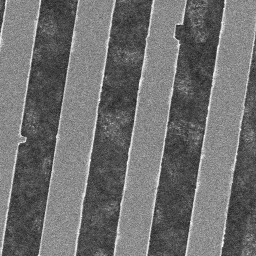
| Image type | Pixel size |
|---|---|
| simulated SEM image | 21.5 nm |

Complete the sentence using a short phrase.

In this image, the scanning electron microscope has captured one or a few lines or trenches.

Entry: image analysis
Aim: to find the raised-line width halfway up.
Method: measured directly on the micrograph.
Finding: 741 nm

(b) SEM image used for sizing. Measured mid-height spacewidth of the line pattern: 824 nanometres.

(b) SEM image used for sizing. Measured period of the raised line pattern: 72.3 pixels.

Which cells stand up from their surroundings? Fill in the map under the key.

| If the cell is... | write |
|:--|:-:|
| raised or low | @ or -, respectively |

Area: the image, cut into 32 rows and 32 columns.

-@@@@-----@@@@-----@@@@-----@@@@
-@@@@-----@@@@-----@@@@-----@@@@
@@@@@----@@@@@-----@@@@-----@@@@
@@@@-----@@@@@-----@@@------@@@@
@@@@-----@@@@@-----@@@-----@@@@@
@@@@-----@@@@-----@@@@-----@@@@@
@@@@-----@@@@-----@@@@-----@@@@@
@@@@-----@@@@-----@@@@-----@@@@-
@@@@-----@@@@-----@@@@-----@@@@-
@@@@----@@@@@-----@@@@-----@@@@-
@@@-----@@@@@----@@@@@-----@@@@-
@@@-----@@@@@----@@@@@----@@@@@-
@@@-----@@@@-----@@@@-----@@@@@-
@@@-----@@@@-----@@@@-----@@@@--
@@@-----@@@@-----@@@@-----@@@@--
@@@----@@@@@-----@@@@-----@@@@--
@@-----@@@@@-----@@@@-----@@@@--
@@@----@@@@@-----@@@@----@@@@@--
@@-----@@@@-----@@@@-----@@@@@--
@@-----@@@@-----@@@@-----@@@@@--
@@-----@@@@-----@@@@-----@@@@---
@@-----@@@@-----@@@@-----@@@@---
@@----@@@@@-----@@@@-----@@@@---
@-----@@@@@-----@@@@-----@@@@---
@-----@@@@@----@@@@@----@@@@@---
@-----@@@@-----@@@@-----@@@@@---
@-----@@@@-----@@@@-----@@@@----
@-----@@@@-----@@@@-----@@@@----
@----@@@@@-----@@@@-----@@@@----
-----@@@@@-----@@@@-----@@@@----
-----@@@@@----@@@@@----@@@@@----
-----@@@@-----@@@@-----@@@@@----